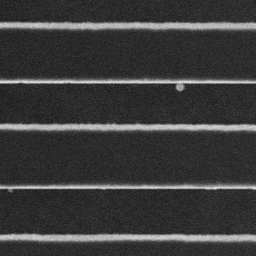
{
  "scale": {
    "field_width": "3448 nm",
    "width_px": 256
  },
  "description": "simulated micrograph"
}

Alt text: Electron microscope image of lines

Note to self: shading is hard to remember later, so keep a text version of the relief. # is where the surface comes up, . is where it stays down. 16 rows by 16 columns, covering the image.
................
................
################
################
################
................
................
................
################
################
################
################
................
................
................
################